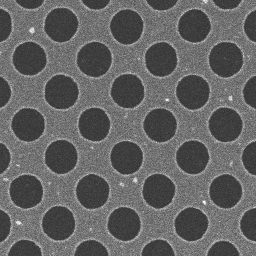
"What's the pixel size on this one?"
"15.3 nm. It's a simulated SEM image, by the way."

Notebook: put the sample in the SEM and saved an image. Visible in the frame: a regular array of holes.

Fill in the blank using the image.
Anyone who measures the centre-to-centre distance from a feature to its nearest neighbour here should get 703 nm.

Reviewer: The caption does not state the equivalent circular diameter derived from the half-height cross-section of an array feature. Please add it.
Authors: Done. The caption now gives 33.9 pixels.